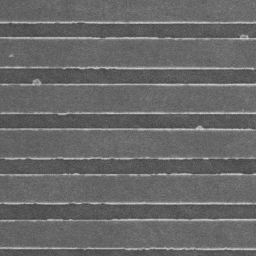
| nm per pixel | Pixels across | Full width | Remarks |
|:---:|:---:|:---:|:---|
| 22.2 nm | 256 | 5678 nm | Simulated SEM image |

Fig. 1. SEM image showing lines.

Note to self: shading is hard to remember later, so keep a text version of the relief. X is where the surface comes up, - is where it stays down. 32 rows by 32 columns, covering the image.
XXXXXXXXXXXXXXXXXXXXXXXXXXXXXXXX
XXXXXXXXXXXXXXXXXXXXXXXXXXXXXXXX
XXXXXXXXXXXXXXXXXXXXXXXXXXXXXXXX
--------------------------------
--------------------------------
XXXXXXXXXXXXXXXXXXXXXXXXXXXXXXXX
XXXXXXXXXXXXXXXXXXXXXXXXXXXXXXXX
XXXXXXXXXXXXXXXXXXXXXXXXXXXXXXXX
---------------XXXXXXXXXXXXXXXXX
--------------------------------
--------------------------------
XXXXXXXXXXXXXXXXXXXXXXXXXXXXXXXX
XXXXXXXXXXXXXXXXXXXXXXXXXXXXXXXX
XXXXXXXXXXXXXXXXXXXXXXXXXXXXXXXX
--------------------------------
--------------------------------
XXXXXXXXXXXXXXXXXXXXXXXXXXXXXXXX
XXXXXXXXXXXXXXXXXXXXXXXXXXXXXXXX
XXXXXXXXXXXXXXXXXXXXXXXXXXXXXXXX
XXXXXXXXXXXXXXXXXXXXXXXXXXXXXXXX
--------------------------------
--------------------------------
XXXXXXXXXXXXXXXXXXXXXXXXXXXXXXXX
XXXXXXXXXXXXXXXXXXXXXXXXXXXXXXXX
XXXXXXXXXXXXXXXXXXXXXXXXXXXXXXXX
--------------------------------
--------------------------------
------X--------XXXXXXXX-XXXXXXXX
XXXXXXXXXXXXXXXXXXXXXXXXXXXXXXXX
XXXXXXXXXXXXXXXXXXXXXXXXXXXXXXXX
XXXXXXXXXXXXXXXXXXXXXXXXXXXXXXXX
--------------------------------